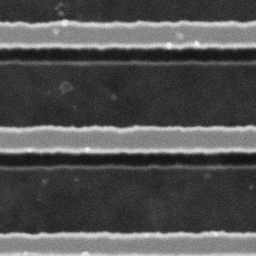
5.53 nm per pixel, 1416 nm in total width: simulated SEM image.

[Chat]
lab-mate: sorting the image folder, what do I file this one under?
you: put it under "lines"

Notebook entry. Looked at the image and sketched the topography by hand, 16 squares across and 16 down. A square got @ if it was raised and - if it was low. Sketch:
----------------
@@@@@@@@@@@@@@@@
@@@@@@@@@@@@@@@@
----------------
----------------
----------------
----------------
----------------
@@@@@@@@@@@@@@@@
@@@@@@@@@@@@@@-@
----------------
----------------
----------------
----------------
-------------@--
@@@@@@@@@@@@@@@@